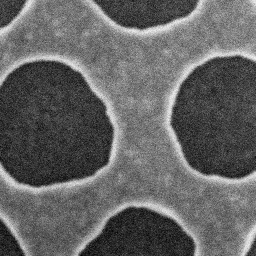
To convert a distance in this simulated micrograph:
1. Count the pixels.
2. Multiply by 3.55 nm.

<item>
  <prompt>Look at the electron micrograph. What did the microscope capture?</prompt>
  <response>holes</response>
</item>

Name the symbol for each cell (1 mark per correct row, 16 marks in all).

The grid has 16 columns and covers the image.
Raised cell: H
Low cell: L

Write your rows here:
LHHHHHLLLLLLHHHH
LHHHHHHLLLHHHHHH
HHHHHHHHHHHHHHHH
HHHHHHHHHHHHHHLH
HLLLLHHHHHHHLLLL
LLLLLLHHHHHLLLLL
LLLLLLLHHHHLLLLL
LLLLLLLHHHHLLLLL
LLLLLLLHHHHLLLLL
LLLLLLLHHHHLLLLL
LLLLLLHHHHHHLLLL
HLLLHHHHHHHHHHHH
HHHHHHHHHHHHHHHH
HHHHHHHLLLLHHHHH
LHHHHHLLLLLLHHHH
LHHHHLLLLLLLHHHH